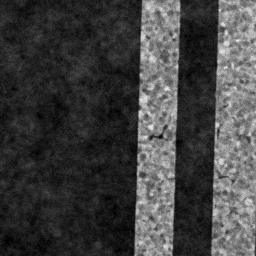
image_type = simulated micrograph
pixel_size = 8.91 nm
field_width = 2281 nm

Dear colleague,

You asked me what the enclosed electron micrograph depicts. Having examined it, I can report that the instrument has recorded one or a few lines or trenches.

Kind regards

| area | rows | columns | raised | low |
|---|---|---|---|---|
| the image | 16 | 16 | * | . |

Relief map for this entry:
.........**...**
.........**...**
.........**...**
.........**...**
.........**...**
.........**...**
.........**...**
.........**...**
.........*....**
.........**...**
.........**..***
.........**..***
.........**..***
.........**..***
........***..***
.........**..***